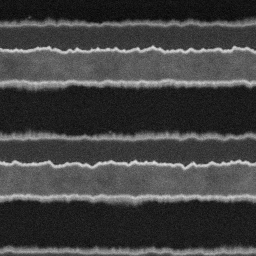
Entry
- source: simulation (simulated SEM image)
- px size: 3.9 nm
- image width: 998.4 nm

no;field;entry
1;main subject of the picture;lines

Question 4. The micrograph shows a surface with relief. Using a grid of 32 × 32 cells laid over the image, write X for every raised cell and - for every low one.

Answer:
--------------------------------
--------------------------------
--------------------------------
XXXXXXXXXXXXXXXXXXXXXXXXXXXXXXXX
XXXXXXXXXXXXXXXXXXXXXXXXXXXXXXXX
XXXXXXXXXXXXXXXXXXXXXXXXXXXXXXXX
XXXXXXXXXXXXXXXXXXXXXXXXXXXXXXXX
XXXXXXXXXXXXXXXXXXXXXXXXXXXXXXXX
XXXXXXXXXXXXXXXXXXXXXXXXXXXXXXXX
XXXXXXXXXXXXXXXXXXXXXXXXXXXXXXXX
X--XXXXXX-XXX-XXXXXX--XXXXXX---X
--------------------------------
--------------------------------
--------------------------------
--------------------------------
--------------------------------
--------------------------------
XXXXXXXXXXXXXXXXXXXXXXXXXXXXXXXX
XXXXXXXXXXXXXXXXXXXXXXXXXXXXXXXX
XXXXXXXXXXXXXXXXXXXXXXXXXXXXXXXX
XXXXXXXXXXXXXXXXXXXXXXXXXXXXXXXX
XXXXXXXXXXXXXXXXXXXXXXXXXXXXXXXX
XXXXXXXXXXXXXXXXXXXXXXXXXXXXXXXX
XXXXXXXXXXXXXXXXXXXXXXXXXXXXXXXX
XXXXXXXXXXXXXXXXXXXXXXXXXXXXXXXX
--------------------------------
--------------------------------
--------------------------------
--------------------------------
--------------------------------
--------------------------------
XXXXXXXXXX--------XXX----------X